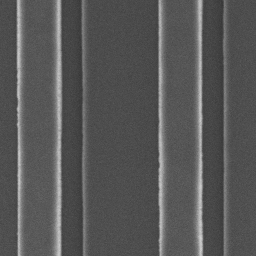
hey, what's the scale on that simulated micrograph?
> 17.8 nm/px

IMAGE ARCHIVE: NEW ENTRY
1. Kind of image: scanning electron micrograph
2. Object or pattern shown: lines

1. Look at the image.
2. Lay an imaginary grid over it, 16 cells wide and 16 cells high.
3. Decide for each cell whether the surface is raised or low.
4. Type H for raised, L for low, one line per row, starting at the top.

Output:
LHHHLLLLLLHHHLLL
LHHHLLLLLLHHHLLL
LHHHLLLLLLHHHLLL
LHHHLLLLLLHHHLLL
LHHHLLLLLLHHHLLL
LHHHLLLLLLHHHLLL
LHHHLLLLLLHHHLLL
LHHHLLLLLLHHHLLL
LHHHLLLLLLHHHLLL
LHHHLLLLLLHHHLLL
LHHHLLLLLLHHHLLL
LHHHLLLLLLHHHLLL
LHHHLLLLLLHHHLLL
LHHHLLLLLLHHHLLL
LHHHLLLLLLHHHLLL
LHHHLLLLLLHHHLLL